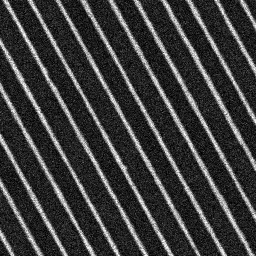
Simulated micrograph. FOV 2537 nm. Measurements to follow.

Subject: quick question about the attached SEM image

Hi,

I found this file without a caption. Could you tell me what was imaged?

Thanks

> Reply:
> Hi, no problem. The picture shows parallel lines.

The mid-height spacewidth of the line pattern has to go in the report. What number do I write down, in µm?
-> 0.192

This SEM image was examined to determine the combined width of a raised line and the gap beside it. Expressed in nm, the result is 229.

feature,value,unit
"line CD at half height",33.6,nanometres